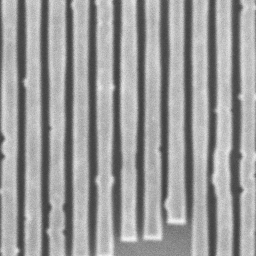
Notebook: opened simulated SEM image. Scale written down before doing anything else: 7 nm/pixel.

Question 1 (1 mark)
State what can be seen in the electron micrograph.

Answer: parallel lines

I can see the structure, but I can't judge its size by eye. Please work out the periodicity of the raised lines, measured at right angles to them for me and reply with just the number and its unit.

0.167 microns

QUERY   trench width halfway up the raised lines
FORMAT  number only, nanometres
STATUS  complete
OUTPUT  62.2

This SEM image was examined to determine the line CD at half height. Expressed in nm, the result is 104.